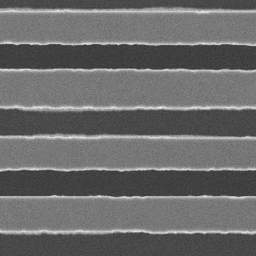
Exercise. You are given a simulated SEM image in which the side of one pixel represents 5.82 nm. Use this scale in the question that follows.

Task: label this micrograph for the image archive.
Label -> lines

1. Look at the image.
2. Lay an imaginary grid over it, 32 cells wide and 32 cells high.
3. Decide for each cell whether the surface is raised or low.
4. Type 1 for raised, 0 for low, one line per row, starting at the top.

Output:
00000000000000000000000000000000
11111111111111111111111111111111
11111111111111111111111111111111
11111111111111111111111111111111
11111111111111111111111111111111
00111101111111101111111111110111
00000000000000000000000000000000
00000000000000000000000000000000
00000000000000000000000000000000
11111111111111111111111111111111
11111111111111111111111111111111
11111111111111111111111111111111
11111111111111111111111111111111
10111111111111111111111111111111
00000000000000000000000000000000
00000000000000000000000000000000
00000000000000000000000000000000
11111111111111111111111111111111
11111111111111111111111111111111
11111111111111111111111111111111
11111111111111111111111111111111
00000000000000000000000000000000
00000000000000000000000000000000
00000000000000000000000000000000
00000010000010000000000001000000
11111111111111111111111111111111
11111111111111111111111111111111
11111111111111111111111111111111
11111111111111111111111111111111
00000000000000000000000000000000
00000000000000000000000000000000
00000000000000000000000000000000